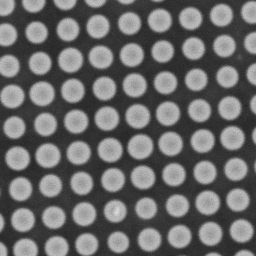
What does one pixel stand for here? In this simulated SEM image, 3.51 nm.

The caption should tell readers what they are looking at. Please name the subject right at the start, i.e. an array of small figures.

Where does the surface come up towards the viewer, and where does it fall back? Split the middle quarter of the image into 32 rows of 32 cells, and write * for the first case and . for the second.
****...****.....**..............
***.............................
........................***....*
.........**....*****...*****..**
****....****...*****...*****..**
*****..******..*****...*****...*
*****..******..*****...****.....
*****...*****...****............
****.....***....................
.**.......................*.....
.................***....****...*
.........****...*****..******..*
.****...*****..******..******..*
******..******..*****..******...
******..******..*****...****....
******...****....***............
.****.....*.....................
.........................***....
.................****...*****...
....*....*****..******..*****...
.*****...*****..******..******..
.*****...*****..******..*****...
.******..*****..*****....***....
.*****...*****...***............
..***...........................
..........................***...
...........***...*****...*****..
...***....*****..*****...*****..
..*****..******..******..*****..
..*****...*****..*****...*****..
..*****...*****...****..........
..*****....**...................